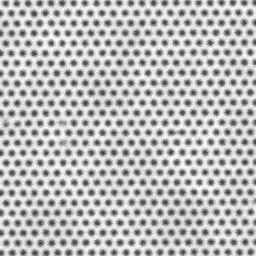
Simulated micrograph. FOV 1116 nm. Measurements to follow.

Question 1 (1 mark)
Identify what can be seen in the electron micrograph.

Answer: a regular array of holes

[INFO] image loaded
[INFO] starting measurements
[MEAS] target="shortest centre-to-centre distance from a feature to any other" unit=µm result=0.0481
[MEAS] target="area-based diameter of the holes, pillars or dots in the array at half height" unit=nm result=32.7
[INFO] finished